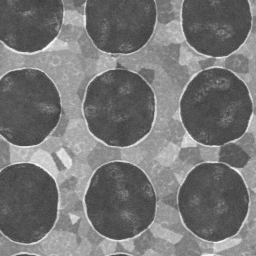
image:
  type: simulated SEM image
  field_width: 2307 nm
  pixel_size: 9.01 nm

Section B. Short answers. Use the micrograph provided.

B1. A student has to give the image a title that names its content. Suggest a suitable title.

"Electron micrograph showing holes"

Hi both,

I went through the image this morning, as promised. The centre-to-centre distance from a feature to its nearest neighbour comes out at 840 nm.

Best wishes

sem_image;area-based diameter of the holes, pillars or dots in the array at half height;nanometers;681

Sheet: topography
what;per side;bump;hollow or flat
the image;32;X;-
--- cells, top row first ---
--------XXX--------XXXX--------X
--------XXX---------XXX--------X
--------XXX---------XXX--------X
--------XXX--------XXXX--------X
-------XXXX--------XXXX--------X
X-----XXXXXX------XXXXXX------XX
XX---XXXXXXXX----XXXXXXXX----XXX
XXXXXXXXXXXXXXXXXXXXXXXXXXXXXXXX
XXXXXXXXXXXXXXXXXXXXXXXXXX--XXXX
------XXXXXX------XXXXXX------XX
-------XXXX--------XXXXX-------X
-------XXXX--------XXXX--------X
--------XXX--------XXXX--------X
--------XX---------XXX----------
--------XXX--------XXXX--------X
-------XXXX--------XXXX--------X
------XXXXX--------XXXX--------X
X-----XXXXXX------XXXXXX-----XXX
XXXXXXXXXXXXXXXXXXXXXXXXXXXXXXXX
XXXXXXXXXXXXXXXXXXXXXXXXXXXXXXXX
XX--XXXXXXXXX---XXXXXXXXX---XXXX
------XXXXXX------XXXXXX------XX
-------XXXX--------XXXX-------XX
-------XXXX--------XXX---------X
-------XXXX---------XX---------X
-------XXXX---------XX---------X
-------XXXX--------XXX---------X
-------XXXX--------XXXX--------X
-------XXXXX------XXXXX-------XX
X-----XXXXXXX----XXXXXXXX----XXX
XXX-XXXXXXXXXXXXXXXXXXXXXXXXXXXX
XXXXXXXXXXXXXXXXXXXXXXXXXXXXXXXX